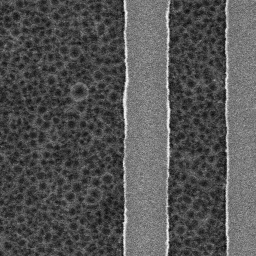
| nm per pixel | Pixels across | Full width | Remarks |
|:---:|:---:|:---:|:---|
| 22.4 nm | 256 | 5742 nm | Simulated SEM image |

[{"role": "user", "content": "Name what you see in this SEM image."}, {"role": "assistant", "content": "one or a few lines or trenches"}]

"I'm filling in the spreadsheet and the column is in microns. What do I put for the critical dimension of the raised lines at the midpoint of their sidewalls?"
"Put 0.962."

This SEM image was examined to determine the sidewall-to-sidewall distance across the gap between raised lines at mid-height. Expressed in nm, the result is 1310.